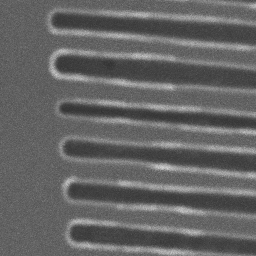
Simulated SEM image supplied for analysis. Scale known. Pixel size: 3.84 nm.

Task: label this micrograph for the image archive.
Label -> parallel lines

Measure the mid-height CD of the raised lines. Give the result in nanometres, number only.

90.4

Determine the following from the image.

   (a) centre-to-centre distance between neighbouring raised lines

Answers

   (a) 163 nm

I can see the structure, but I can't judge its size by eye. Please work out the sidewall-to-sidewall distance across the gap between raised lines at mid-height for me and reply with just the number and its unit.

69.8 nm